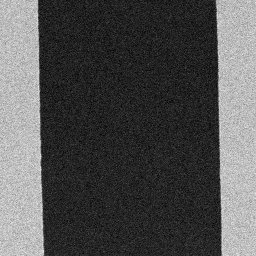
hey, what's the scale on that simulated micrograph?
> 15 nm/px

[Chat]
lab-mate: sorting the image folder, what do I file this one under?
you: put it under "one or a few lines or trenches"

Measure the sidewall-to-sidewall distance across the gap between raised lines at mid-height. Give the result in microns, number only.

2.7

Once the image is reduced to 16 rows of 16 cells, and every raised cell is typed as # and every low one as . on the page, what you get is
##............##
##............##
##............##
##............##
##............##
##............##
##............##
##............##
###...........##
###...........##
###...........##
###...........##
###...........##
###...........##
###...........##
###...........##